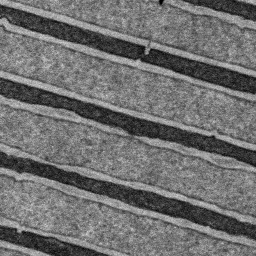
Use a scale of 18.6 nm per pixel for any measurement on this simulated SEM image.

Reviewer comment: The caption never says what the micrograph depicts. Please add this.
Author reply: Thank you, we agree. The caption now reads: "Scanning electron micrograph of one or a few lines or trenches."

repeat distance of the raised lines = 1300 nanometres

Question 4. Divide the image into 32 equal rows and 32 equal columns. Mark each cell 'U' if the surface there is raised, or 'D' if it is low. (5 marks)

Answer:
DDUUUUUUUUUUUUUUUUUUUUDDDDDDDDDD
DDDDDUUUUUUUUUUUUUUUUUUUUDDDDDDD
DDDDDDDDDUUUUUUUUUUUUUUUUUUUUUDD
UDDDDDDDDDDDUUUUUUUUUUUUUUUUUUUU
UUUUUDDDDDDDDDDUUUUUUUUUUUUUUUUU
UUUUUUUUDDDDDDDDDDUUUUUUUUUUUUUU
UUUUUUUUUUUDDDDDDDDDDDUUUUUUUUUU
UUUUUUUUUUUUUUUDDDDDDDDDDDUUUUUU
UUUUUUUUUUUUUUUUUUUDDDDDDDDDDDUU
DUUUUUUUUUUUUUUUUUUUUUDDDDDDDDDD
DDDDDUUUUUUUUUUUUUUUUUUUUDDDDDDD
DDDDDDDDUUUUUUUUUUUUUUUUUUUUUDDD
DDDDDDDDDDDUUUUUUUUUUUUUUUUUUUUU
UUUUUDDDDDDDDDUUUUUUUUUUUUUUUUUU
UUUUUUUUDDDDDDDDDDUUUUUUUUUUUUUU
UUUUUUUUUUUUDDDDDDDDDDUUUUUUUUUU
UUUUUUUUUUUUUUDDDDDDDDDDDUUUUUUU
UUUUUUUUUUUUUUUUUUDDDDDDDDDDDUUU
DUUUUUUUUUUUUUUUUUUUUUDDDDDDDDDD
DDDDUUUUUUUUUUUUUUUUUUUUUUDDDDDD
DDDDDDDUUUUUUUUUUUUUUUUUUUUUUDDD
UDDDDDDDDDDUUUUUUUUUUUUUUUUUUUUU
UUUUUDDDDDDDDDUUUUUUUUUUUUUUUUUU
UUUUUUUUDDDDDDDDDDDUUUUUUUUUUUUU
UUUUUUUUUUUDDDDDDDDDDDUUUUUUUUUU
UUUUUUUUUUUUUUDDDDDDDDDDDUUUUUUU
UUUUUUUUUUUUUUUUUUDDDDDDDDDDUUUU
UUUUUUUUUUUUUUUUUUUUUDDDDDDDDDDD
DDUUUUUUUUUUUUUUUUUUUUUUUDDDDDDD
DDDDDDDUUUUUUUUUUUUUUUUUUUUUDDDD
DDDDDDDDDDDUUUUUUUUUUUUUUUUUUUUD
UUUUDDDDDDDDDDUUUUUUUUUUUUUUUUUU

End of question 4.